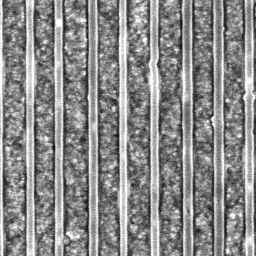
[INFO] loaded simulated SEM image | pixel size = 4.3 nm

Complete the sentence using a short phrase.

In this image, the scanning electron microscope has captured parallel lines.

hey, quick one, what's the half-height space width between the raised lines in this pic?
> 97.4 nanometers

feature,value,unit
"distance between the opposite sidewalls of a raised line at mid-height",33.4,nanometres